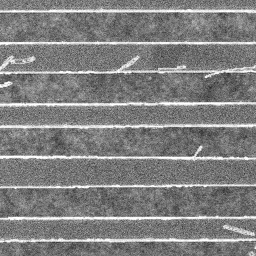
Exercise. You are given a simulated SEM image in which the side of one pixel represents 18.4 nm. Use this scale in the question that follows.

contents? lines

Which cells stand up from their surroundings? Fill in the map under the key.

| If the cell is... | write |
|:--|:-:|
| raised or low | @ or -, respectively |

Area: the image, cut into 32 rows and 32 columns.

@@@@@@@@@@@@@@@@@@@@@@@@@@@@@@@@
--------------------------------
--------------------------------
--------------------------------
--------------------------------
@@@@@@@@@@@@@@@@@@@@@@@@@@@@@@@@
@@@@@@@@@@@@@@@@@@@@@@@@@@@@@@@@
@@@@@@@@@@@@@@@@@@@@@@@@@@@@@@@@
@@@@@@@@@@@@@@@@@@@@@@@@@@@@@@@@
--------------------------------
--------------------------------
--------------------------------
--------------------------------
@@@@@@@@@@@@@@@@@@@@@@@@@@@@@@@@
@@@@@@@@@@@@@@@@@@@@@@@@@@@@@@@@
@@@@@@@@@@@@@@@@@@@@@@@@@@@@@@@@
--------------------------------
--------------------------------
--------------------------------
--------------------------------
@@@@@@@@@@@@@@@@@@@@@@@@@@@@@@@@
@@@@@@@@@@@@@@@@@@@@@@@@@@@@@@@@
@@@@@@@@@@@@@@@@@@@@@@@@@@@@@@@@
-@------------------------------
--------------------------------
--------------------------------
--------------------------------
@@@@@@@@@@@@@@@@@@@@@@@@@@@@@@@@
@@@@@@@@@@@@@@@@@@@@@@@@@@@@@@@@
@@@@@@@@@@@@@@@@@@@@@@@@@@@@@@@@
--------------------------------
--------------------------------